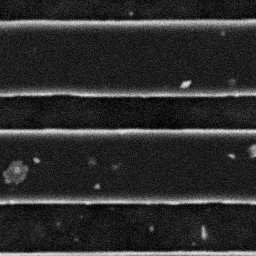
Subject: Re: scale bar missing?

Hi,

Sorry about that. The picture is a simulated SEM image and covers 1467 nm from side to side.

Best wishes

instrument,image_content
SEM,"lines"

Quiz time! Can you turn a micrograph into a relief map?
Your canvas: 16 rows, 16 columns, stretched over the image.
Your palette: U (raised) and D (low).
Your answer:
DDDDDDDDDDDDDDDD
UUUUUUUUUUUUUUUU
UUUUUUUUUUUUUUUU
UUUUUUUUUUUUUUUU
UUUUUUUUUUUUUUUU
UUUUUUUUUUUUUUUU
DDDDDDDDDDDDDDDD
DDDDDDDDDDDDDDDD
UUUUUUUUUUUUUUUU
UUUUUUUUUUUUUUUU
UUUUUUUUUUUUUUUU
UUUUUUUUUUUUUUUU
UUUUUUUUUUUUUUUU
DDDDDDDDDDDDDDDD
DDDDDDDDDDDDDDDD
DDDDDDDDDDDDDDDD